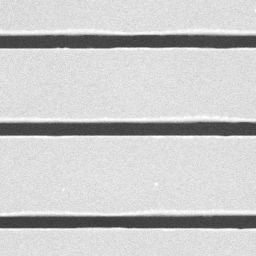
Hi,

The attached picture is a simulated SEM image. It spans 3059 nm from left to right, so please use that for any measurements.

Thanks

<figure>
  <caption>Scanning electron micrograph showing lines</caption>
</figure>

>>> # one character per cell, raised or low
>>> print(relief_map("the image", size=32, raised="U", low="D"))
UUUUUUUUUUUUUUUUUUUUUUUUUUUUUUUU
UUUUUUUUUUUUUUUUUUUUUUUUUUUUUUUU
UUUUUUUUUUUUUUUUUUUUUUUUUUUUUUUU
UUUUUUUUUUUUUUUUUUUUUUUUUUUUUUUU
DDDDDDDDDDDDDDDDDDDDDDDDDDDDDDDD
DDDDDDDDDDDDDDDDDDDDDDDDDDDDDDDD
UUUUUUUUUUUUUUUUUUUUUUUUUUUUUUUU
UUUUUUUUUUUUUUUUUUUUUUUUUUUUUUUU
UUUUUUUUUUUUUUUUUUUUUUUUUUUUUUUU
UUUUUUUUUUUUUUUUUUUUUUUUUUUUUUUU
UUUUUUUUUUUUUUUUUUUUUUUUUUUUUUUU
UUUUUUUUUUUUUUUUUUUUUUUUUUUUUUUU
UUUUUUUUUUUUUUUUUUUUUUUUUUUUUUUU
UUUUUUUUUUUUUUUUUUUUUUUUUUUUUUUU
UUUUUUUUUUUUUUUUUUUUUUUUUUUUUUUU
DDDDDDDDDDDDDDDDDDDDDDDDDDDDDDDD
DDDDDDDDDDDDDDDDDDDDDDDDDDDDDDDD
UUUUUUUUUUUUUUUUUUUUUUUUUUUUUUUU
UUUUUUUUUUUUUUUUUUUUUUUUUUUUUUUU
UUUUUUUUUUUUUUUUUUUUUUUUUUUUUUUU
UUUUUUUUUUUUUUUUUUUUUUUUUUUUUUUU
UUUUUUUUUUUUUUUUUUUUUUUUUUUUUUUU
UUUUUUUUUUUUUUUUUUUUUUUUUUUUUUUU
UUUUUUUUUUUUUUUUUUUUUUUUUUUUUUUU
UUUUUUUUUUUUUUUUUUUUUUUUUUUUUUUU
UUUUUUUUUUUUUUUUUUUUUUUUUUUUUUUU
UUUUUUUUUUUUUUUUUUUUUUUUUUUUUUUU
DDDDDDDDDDDDDDDDDDDDDDDDDDDDDDDD
DDDDDDDDDDDDDDDDDDDDDDDDDDDDDDDD
UUUUUUUUUUUUUUUUUUUUUUUUUUUUUUUU
UUUUUUUUUUUUUUUUUUUUUUUUUUUUUUUU
UUUUUUUUUUUUUUUUUUUUUUUUUUUUUUUU